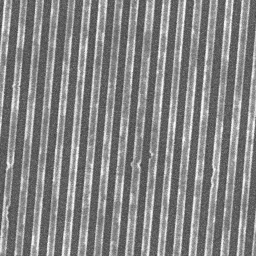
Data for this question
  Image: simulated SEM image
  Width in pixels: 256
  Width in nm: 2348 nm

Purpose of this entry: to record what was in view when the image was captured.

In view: parallel lines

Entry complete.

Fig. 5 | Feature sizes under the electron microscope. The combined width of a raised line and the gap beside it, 0.145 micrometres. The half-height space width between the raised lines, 8.71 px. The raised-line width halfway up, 62.8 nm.